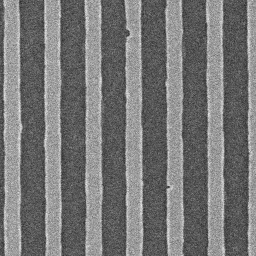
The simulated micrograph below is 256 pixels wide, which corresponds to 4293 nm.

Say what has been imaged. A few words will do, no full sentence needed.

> parallel lines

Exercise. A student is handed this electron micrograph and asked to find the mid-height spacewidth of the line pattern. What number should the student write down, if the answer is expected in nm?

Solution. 435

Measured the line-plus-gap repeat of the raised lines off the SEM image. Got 0.682 µm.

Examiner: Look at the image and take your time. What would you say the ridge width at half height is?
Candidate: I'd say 254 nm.